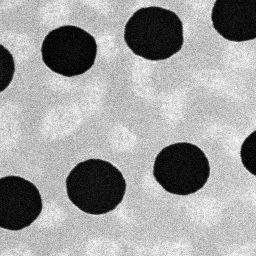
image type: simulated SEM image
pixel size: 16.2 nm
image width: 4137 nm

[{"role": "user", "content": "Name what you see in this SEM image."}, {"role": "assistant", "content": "holes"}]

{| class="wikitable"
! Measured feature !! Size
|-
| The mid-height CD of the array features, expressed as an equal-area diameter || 908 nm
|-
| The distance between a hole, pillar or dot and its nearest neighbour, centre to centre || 1410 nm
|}